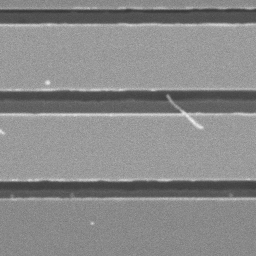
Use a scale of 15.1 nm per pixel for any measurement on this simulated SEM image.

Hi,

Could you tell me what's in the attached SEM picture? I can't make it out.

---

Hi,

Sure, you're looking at lines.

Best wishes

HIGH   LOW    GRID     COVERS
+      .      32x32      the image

++++++++++++++++++++++++++++++++
................................
................................
++++++++++++++++++++++++++++++++
++++++++++++++++++++++++++++++++
++++++++++++++++++++++++++++++++
++++++++++++++++++++++++++++++++
++++++++++++++++++++++++++++++++
++++++++++++++++++++++++++++++++
++++++++++++++++++++++++++++++++
++++++++++++++++++++++++++++++++
................................
................................
................................
++++++++++++++++++++++++++++++++
++++++++++++++++++++++++++++++++
++++++++++++++++++++++++++++++++
++++++++++++++++++++++++++++++++
++++++++++++++++++++++++++++++++
++++++++++++++++++++++++++++++++
++++++++++++++++++++++++++++++++
++++++++++++++++++++++++++++++++
+++++.+++++++++++.++++.++.+.....
................................
................................
++++++++++++++++++++++++++++++++
++++++++++++++++++++++++++++++++
++++++++++++++++++++++++++++++++
++++++++++++++++++++++++++++++++
++++++++++++++++++++++++++++++++
++++++++++++++++++++++++++++++++
++++++++++++++++++++++++++++++++